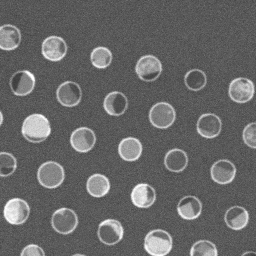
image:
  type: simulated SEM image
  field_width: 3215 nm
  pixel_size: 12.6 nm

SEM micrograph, a regular array of raised bodies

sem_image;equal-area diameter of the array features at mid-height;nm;296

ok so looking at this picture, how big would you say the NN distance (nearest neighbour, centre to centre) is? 597 nanometres